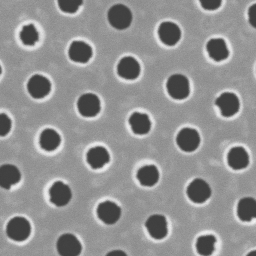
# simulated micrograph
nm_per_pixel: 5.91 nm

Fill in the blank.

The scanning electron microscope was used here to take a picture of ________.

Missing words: a regular array of holes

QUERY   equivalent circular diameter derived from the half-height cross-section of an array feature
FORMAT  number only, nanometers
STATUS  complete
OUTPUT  139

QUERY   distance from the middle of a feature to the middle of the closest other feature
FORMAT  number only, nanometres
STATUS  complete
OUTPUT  304